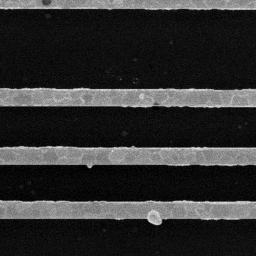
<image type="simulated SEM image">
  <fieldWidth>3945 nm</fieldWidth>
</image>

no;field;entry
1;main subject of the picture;lines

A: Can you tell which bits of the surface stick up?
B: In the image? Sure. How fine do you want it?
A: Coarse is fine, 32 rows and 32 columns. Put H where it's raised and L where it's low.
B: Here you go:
HHHHHHHHHHHHHHHHHHHHHHHHHHHHHHHH
LLLLLLLLLLLLLLLLLLLLLLLLLLLLLLLL
LLLLLLLLLLLLLLLLLLLLLLLLLLLLLLLL
LLLLLLLLLLLLLLLLLLLLLLLLLLLLLLLL
LLLLLLLLLLLLLLLLLLLLLLLLLLLLLLLL
LLLLLLLLLLLLLLLLLLLLLLLLLLLLLLLL
LLLLLLLLLLLLLLLLLLLLLLLLLLLLLLLL
LLLLLLLLLLLLLLLLLLLLLLLLLLLLLLLL
LLLLLLLLLLLLLLLLLLLLLLLLLLLLLLLL
LLLLLLLLLLLLLLLLLLLLLLLLLLLLLLLL
LLLLLLLLLLLLLLLLLLLLLLLLLLLLLLLL
HHHHHHHHHHHHHHHHHHHHHHHHHHHHHHHH
HHHHHHHHHHHHHHHHHHHHHHHHHHHHHHHH
LLLLLLLLLLLLLLLLLLLLLLLLLLLLLLLL
LLLLLLLLLLLLLLLLLLLLLLLLLLLLLLLL
LLLLLLLLLLLLLLLLLLLLLLLLLLLLLLLL
LLLLLLLLLLLLLLLLLLLLLLLLLLLLLLLL
LLLLLLLLLLLLLLLLLLLLLLLLLLLLLLLL
LLHLLHHHHLLLLLLLHLLLLLLLLLLLLLLL
HHHHHHHHHHHHHHHHHHHHHHHHHHHHHHHH
HHHHHHHHHHHHHHHHHHHHHHHHHHHHHHHH
LLLLLLLLLLLLLLLLLLLLLLLLLLLLLLLL
LLLLLLLLLLLLLLLLLLLLLLLLLLLLLLLL
LLLLLLLLLLLLLLLLLLLLLLLLLLLLLLLL
LLLLLLLLLLLLLLLLLLLLLLLLLLLLLLLL
HHHHHHHHHHHHHHHHHHHHHHHHHHHHHHHH
HHHHHHHHHHHHHHHHHHHHHHHHHHHHHHHH
LLLLLLLLLLLLLLLLLLHHHLLLLLLLLLLL
LLLLLLLLLLLLLLLLLLLLLLLLLLLLLLLL
LLLLLLLLLLLLLLLLLLLLLLLLLLLLLLLL
LLLLLLLLLLLLLLLLLLLLLLLLLLLLLLLL
LLLLLLLLLLLLLLLLLLLLLLLLLLLLLLLL